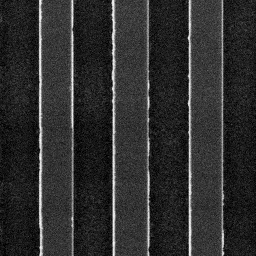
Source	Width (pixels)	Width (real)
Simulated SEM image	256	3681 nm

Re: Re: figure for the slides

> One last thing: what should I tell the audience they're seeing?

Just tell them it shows lines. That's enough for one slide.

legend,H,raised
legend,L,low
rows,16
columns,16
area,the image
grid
LLHHHLLHHLLLHHLL
LLHHHLLHHLLLHHLL
LLHHHLLHHLLLHHLL
LLHHHLLHHLLLHHLL
LLHHHLLHHLLLHHLL
LLHHHLLHHLLLHHLL
LLHHHLLHHLLLHHLL
LLHHHLLHHLLLHHLL
LLHHHLLHHLLLHHLL
LLHHHLLHHLLLHHLL
LLHHHLLHHLLLHHLL
LLHHHLLHHLLLHHLL
LLHHHLLHHLLLHHLL
LLHHHLLHHLLLHHLL
LLHHHLLHHLLLHHLL
LLLHHLLHHLLLHHLL